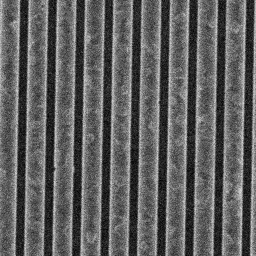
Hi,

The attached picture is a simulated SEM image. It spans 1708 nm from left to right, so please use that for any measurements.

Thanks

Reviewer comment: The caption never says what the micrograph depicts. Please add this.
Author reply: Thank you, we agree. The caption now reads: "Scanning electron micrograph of parallel lines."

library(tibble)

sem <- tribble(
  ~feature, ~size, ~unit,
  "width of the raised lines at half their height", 124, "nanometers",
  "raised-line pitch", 188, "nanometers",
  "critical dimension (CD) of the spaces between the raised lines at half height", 65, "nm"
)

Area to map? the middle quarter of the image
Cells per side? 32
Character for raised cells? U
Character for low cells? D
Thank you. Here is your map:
UUUDDUUUUUDDUUUUUDDUUUUUDDUUUUUD
UUUDDUUUUUDDUUUUUDDUUUUUDDUUUUUD
UUUDDUUUUUDDUUUUUDDUUUUUDDUUUUUD
UUUDDUUUUUDDUUUUUDDUUUUUDDUUUUUD
UUUDDUUUUUDDUUUUUDDUUUUUDDUUUUUD
UUUDDUUUUUDDUUUUUDDUUUUUDDUUUUUD
UUUDDUUUUUDDUUUUDDDUUUUUDDUUUUUD
UUUDDUUUUUDDUUUUDDDUUUUUDDUUUUUD
UUUDDUUUUUDDUUUUDDDUUUUUDDUUUUUD
UUDDDUUUUUDDUUUUDDDUUUUUDDUUUUUD
UUDDDUUUUUDDUUUUDDDUUUUUDDUUUUUD
UUDDDUUUUUDDUUUUUDDUUUUDDDUUUUUD
UUDDDUUUUUDDUUUUDDDUUUUDDDUUUUUD
UUDDDUUUUUDDUUUUDDDUUUUDDDUUUUUD
UUDDDUUUUDDDUUUUDDDUUUUDDDUUUUUD
UUDDDUUUUDDDUUUUDDDUUUUDDDUUUUUD
UUDDDUUUUDDDUUUUDDDUUUUDDDUUUUDD
UUDDDUUUUDDDUUUUDDDUUUUDDDUUUUDD
UUDDDUUUUDDDUUUUDDDUUUUDDDUUUUDD
UUDDDUUUUDDDUUUUDDDUUUUDDDUUUUDD
UUDDDUUUUDDDUUUUDDDUUUUDDDUUUUDD
UUDDDUUUUDDDUUUUDDDUUUUDDDUUUUDD
UUDDDUUUUDDDUUUUDDDUUUUDDDUUUUDD
UUDDDUUUUDDDUUUUDDDUUUUDDDUUUUDD
UUDDDUUUUDDDUUUUDDDUUUUDDDUUUUDD
UUDDDUUUUDDDUUUUDDDUUUUDDDUUUUDD
UUDDDUUUUDDDUUUUDDDUUUUDDDUUUUDD
UUDDDUUUUDDDUUUUDDDUUUUDDDUUUUDD
UUDDDUUUUDDDUUUUDDDUUUUDDDUUUUDD
UUDDDUUUUDDDUUUUDDDUUUUDDDUUUUDD
UUDDDUUUUDDDUUUUDDDUUUUDDDUUUUDD
UUDDDUUUUDDDUUUUDDDUUUUDDDUUUUDD